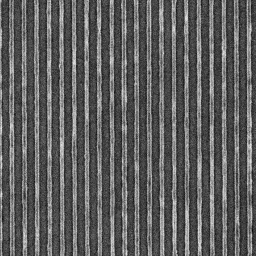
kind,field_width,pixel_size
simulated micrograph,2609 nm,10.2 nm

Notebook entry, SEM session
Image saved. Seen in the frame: parallel lines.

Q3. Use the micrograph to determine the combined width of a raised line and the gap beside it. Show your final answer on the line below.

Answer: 127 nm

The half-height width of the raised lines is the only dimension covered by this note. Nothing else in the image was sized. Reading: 3.5 px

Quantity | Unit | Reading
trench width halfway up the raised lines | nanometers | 91.7